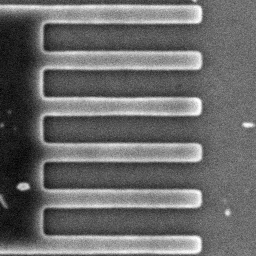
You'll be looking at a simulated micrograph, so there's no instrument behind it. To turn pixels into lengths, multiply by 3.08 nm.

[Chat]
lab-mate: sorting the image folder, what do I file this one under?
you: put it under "groups of lines, slits or small figures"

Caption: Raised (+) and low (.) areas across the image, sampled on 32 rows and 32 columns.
................................
+++++++++++++++++++++++++.......
+++++++++++++++++++++++++.......
+++++...........................
+++++...........................
+++++...........................
++++++....+++++++++....+........
+++++++++++++++++++++++++.......
++++++...++++++++++++++++.......
+++++...........................
+++++...........................
+++++...........................
+++++++++++++++++++++++++.......
+++++++++++++++++++++++++.......
++++++..........................
+++++...........................
+++++...........................
+++++...........................
+++++++++++++++++++++++++.......
+++++++++++++++++++++++++.......
++++++..........................
+++++...........................
+++++...........................
++++++..........................
+++++++++++++++++++++++++.......
+++++++++++++++++++++++++.......
+++++...........................
+++++...........................
+++++...........................
++++++..........................
+++++++++++++++++++++++++.......
++++++++++++++++...+++++........